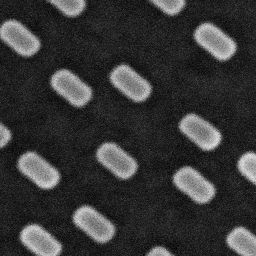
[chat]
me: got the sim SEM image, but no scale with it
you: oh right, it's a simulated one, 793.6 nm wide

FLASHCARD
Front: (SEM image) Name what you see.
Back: a regular array of raised bodies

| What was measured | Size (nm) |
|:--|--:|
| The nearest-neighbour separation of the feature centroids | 197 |